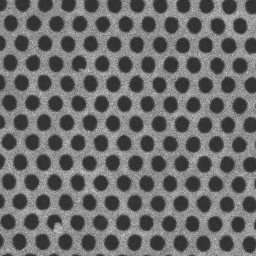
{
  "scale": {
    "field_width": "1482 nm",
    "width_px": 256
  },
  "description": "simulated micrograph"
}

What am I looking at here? a regular array of holes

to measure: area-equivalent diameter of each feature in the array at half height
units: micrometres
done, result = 0.0856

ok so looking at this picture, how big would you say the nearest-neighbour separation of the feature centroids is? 130 nm